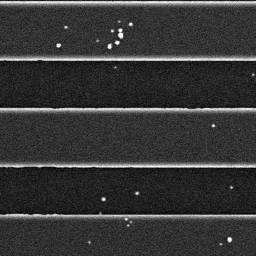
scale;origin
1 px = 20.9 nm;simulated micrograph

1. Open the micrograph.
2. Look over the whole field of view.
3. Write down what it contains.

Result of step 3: lines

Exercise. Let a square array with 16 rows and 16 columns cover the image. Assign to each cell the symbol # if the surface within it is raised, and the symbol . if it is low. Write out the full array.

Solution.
################
################
################
################
................
................
................
################
################
################
................
................
................
################
################
################